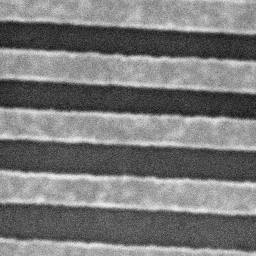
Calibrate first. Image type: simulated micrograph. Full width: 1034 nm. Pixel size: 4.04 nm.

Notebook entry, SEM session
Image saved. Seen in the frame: lines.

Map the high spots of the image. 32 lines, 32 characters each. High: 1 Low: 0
11111111111111111111111111111111
11111111111111111111111111111111
11111111111111111111111111111111
00000000000000000000111111111111
00000000000000000000000000000000
00000000000000000000000000000000
11111000000000000000000000000000
11111111111111111111111110100000
11111111111111111111111111111111
11111111111111111111111111111111
00000000000000111111111111111111
00000000000000000000000000000011
00000000000000000000000000000000
00000000000000000000000000000000
11111111111111111110100000000000
11111111111111111111111111111111
11111111111111111111111111111111
00000001111111111111111111111111
00000000000000000000000000011111
00000000000000000000000000000000
00000000000000000000000000000000
10000000000000000000000000000000
11111111111111111111000100000000
11111111111111111111111111111111
11111111111111111111111111111111
00000001111111111111111111111111
00000000000000000000000000011111
00000000000000000000000000000000
00000000000000000000000000000000
00000000000000000000000000000000
11111111110000000000000000000000
11111111111111111111111111111100